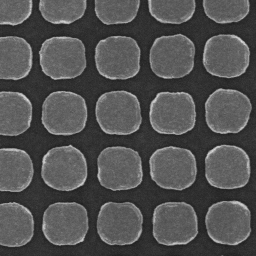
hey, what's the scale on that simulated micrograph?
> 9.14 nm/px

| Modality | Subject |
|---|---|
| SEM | a regular array of raised bodies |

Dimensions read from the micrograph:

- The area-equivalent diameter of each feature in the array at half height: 419 nm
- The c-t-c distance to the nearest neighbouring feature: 494 nanometres